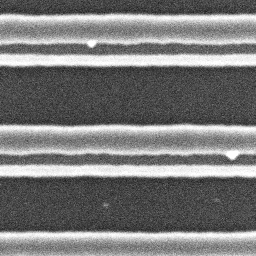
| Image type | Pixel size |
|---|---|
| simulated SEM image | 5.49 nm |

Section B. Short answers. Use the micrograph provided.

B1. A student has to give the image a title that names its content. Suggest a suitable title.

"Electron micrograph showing lines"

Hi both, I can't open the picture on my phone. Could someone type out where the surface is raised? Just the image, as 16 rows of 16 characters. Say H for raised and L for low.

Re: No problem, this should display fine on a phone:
LLLLLLLLLLLLLLLL
HHHHHHHHHHHHHHHH
HHHHHHHHHHHHHHHH
HHHHHHHHHHHHHHHH
LLLLLLLLLLLLLLLL
LLLLLLLLLLLLLLLL
LLLLLLLLLLLLLLLL
LLLLLLLLLLLLLLLL
HHHHHHHHHHHHHHHH
HHHHHHHHHHHHHHHH
HHHHHHHHHHHHHHHH
LLLLLLLLLLLLLLLL
LLLLLLLLLLLLLLLL
LLLLLLLLLLLLLLLL
LLLLLLLLLLLLLLLL
HHHHHHHHHHHHHHHH